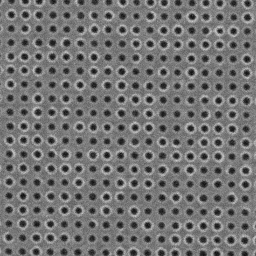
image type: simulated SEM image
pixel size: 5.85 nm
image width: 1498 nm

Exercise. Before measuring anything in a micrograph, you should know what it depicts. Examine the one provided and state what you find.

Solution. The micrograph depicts a regular array of holes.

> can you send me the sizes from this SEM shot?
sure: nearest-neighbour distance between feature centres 0.0798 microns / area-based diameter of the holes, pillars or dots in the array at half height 44.3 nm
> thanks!